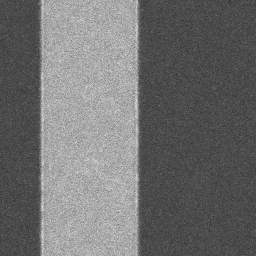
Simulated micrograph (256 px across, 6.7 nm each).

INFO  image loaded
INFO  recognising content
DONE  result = one or a few lines or trenches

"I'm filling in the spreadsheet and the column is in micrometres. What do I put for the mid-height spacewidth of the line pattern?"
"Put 0.628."